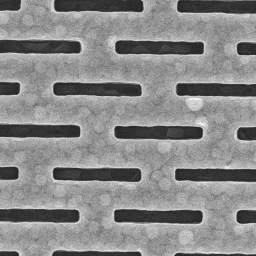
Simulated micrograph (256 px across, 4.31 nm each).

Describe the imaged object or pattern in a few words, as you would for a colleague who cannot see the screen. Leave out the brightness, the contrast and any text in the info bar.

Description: holes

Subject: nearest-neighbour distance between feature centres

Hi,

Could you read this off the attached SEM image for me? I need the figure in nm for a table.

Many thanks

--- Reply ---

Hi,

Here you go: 324